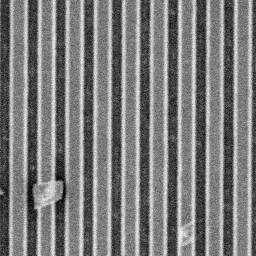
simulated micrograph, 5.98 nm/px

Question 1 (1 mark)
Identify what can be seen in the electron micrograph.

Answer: parallel lines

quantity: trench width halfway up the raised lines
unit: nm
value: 75.5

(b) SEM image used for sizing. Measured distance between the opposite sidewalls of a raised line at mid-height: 93.5 nm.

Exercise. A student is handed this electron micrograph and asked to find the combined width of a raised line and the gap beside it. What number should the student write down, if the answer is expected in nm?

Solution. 168